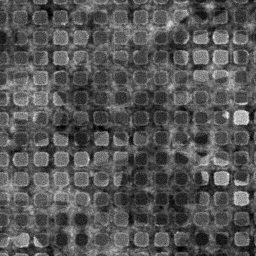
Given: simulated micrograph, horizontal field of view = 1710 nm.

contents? a regular array of raised bodies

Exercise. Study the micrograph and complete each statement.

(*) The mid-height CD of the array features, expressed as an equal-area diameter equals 98.8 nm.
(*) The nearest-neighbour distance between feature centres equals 133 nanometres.